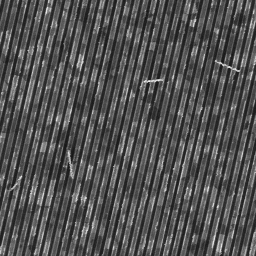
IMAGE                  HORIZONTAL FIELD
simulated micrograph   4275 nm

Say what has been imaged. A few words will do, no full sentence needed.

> parallel lines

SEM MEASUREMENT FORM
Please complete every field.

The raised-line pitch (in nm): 140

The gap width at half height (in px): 3.41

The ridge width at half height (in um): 0.0854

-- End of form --